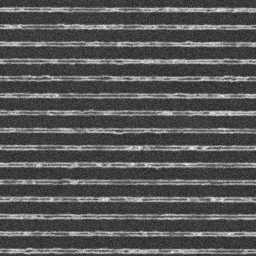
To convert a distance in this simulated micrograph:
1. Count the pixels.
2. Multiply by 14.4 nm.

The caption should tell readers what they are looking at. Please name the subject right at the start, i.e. parallel lines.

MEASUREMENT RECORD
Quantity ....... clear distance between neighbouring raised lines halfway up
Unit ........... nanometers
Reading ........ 196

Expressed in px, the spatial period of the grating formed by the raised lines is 17.2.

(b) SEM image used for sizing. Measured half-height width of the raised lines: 61.2 nm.